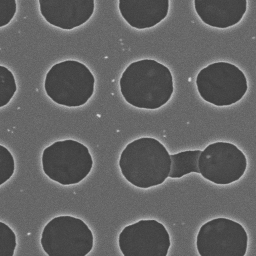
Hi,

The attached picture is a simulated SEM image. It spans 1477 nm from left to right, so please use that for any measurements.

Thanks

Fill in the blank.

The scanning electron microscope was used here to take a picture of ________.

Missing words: holes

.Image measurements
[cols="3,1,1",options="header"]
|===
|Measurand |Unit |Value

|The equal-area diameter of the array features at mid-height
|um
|0.274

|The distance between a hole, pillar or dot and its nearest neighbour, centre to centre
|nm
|438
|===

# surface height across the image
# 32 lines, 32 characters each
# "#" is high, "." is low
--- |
..###.......###......###.......#
..###.......###......####......#
.#####.....#####....#####.....##
########.########.##############
################################
################################
################################
##################.#############
.#####.....#####.....#####....##
..####......###......####......#
..####......###.......###......#
..####......###.......###......#
.######....#####.....#####....##
##################..############
################################
################################
################################
########.########...############
.#####.....#####.....#####....##
..###......####................#
..###.......###................#
..####.....####................#
.######...######.....#####....##
################################
################################
################################
################################
######....#################..###
.#####.....#####.....####.....##
..###.......###......####......#
..###.......###......####......#
..####.....####......####......#